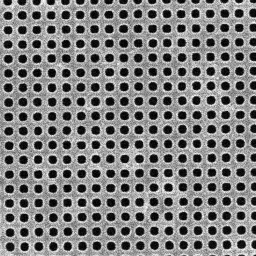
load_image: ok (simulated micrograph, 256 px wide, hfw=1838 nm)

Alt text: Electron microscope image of a regular array of holes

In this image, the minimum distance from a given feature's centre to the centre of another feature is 102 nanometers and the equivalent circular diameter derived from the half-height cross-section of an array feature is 66.8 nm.